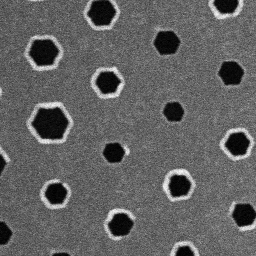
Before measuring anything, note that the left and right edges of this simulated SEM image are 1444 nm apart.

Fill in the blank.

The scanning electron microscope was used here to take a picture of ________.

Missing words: a regular array of holes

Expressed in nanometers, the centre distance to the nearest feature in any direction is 398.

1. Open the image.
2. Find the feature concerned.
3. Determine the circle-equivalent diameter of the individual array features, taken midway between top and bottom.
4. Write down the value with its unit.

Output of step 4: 132 nm